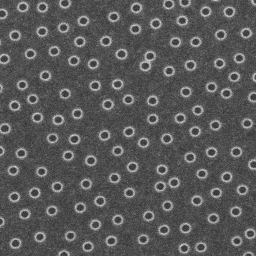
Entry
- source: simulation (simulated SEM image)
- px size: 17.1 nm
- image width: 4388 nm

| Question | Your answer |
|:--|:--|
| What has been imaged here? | a regular array of holes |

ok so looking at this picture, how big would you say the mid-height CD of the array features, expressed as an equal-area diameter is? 144 nanometres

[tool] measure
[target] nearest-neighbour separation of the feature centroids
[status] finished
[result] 20.5 px